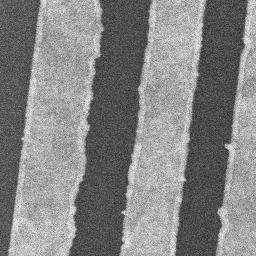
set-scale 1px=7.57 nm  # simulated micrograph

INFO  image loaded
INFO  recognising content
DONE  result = one or a few lines or trenches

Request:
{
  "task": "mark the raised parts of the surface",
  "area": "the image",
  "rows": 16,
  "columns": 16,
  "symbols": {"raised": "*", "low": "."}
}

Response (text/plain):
...***...****...
..****...****..*
..****...****..*
..****...***...*
..****...***...*
..****...***...*
..****...***...*
..***....***...*
..***....***...*
.****...****..**
.****...***...**
.****...***...**
.****...***...**
.****...***...**
.****...***...**
.***....***...**